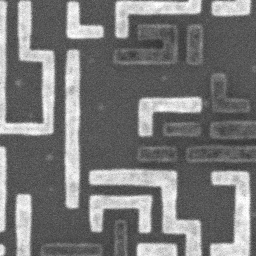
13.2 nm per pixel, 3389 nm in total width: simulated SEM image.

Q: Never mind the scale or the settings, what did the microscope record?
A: wiring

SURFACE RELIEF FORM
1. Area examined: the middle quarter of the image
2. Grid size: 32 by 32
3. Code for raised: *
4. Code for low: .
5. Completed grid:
.**.............................
.***............................
.***............................
.***............................
.**.............................
.**.............................
.**.............................
.**.............................
.**.............................
.**................*************
.**................*************
.**................*************
.***...............***..........
.**................***..........
.**................***..........
.**................***...*******
.**................***...*******
.**................***...*******
.**.............................
.**.............................
.**.............................
.**................*********...*
***................*********...*
***................*********...*
***.............................
.**.............................
.**.............................
.**....*********************....
.**....*********************....
.**....*********************....
.**.....................****....
.**......................***....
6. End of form